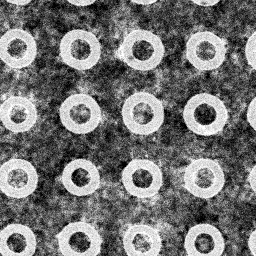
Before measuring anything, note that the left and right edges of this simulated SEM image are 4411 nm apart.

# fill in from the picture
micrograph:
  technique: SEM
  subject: a regular array of ring-shaped raised bodies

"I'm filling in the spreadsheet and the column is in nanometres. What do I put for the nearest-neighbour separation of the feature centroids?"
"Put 1070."